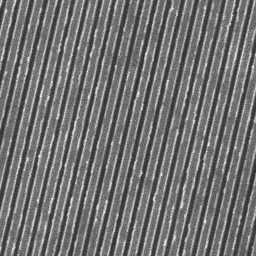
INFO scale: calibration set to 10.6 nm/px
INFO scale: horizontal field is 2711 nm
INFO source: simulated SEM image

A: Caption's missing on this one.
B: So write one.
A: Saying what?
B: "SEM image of parallel lines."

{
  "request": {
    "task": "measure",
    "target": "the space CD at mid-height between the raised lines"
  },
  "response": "50.4 nm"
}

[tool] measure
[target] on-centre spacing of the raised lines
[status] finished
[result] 142 nm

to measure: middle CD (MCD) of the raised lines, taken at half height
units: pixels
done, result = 8.65